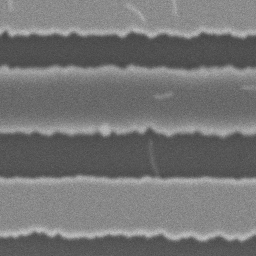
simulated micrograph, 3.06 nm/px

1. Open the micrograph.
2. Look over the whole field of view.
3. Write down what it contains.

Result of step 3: lines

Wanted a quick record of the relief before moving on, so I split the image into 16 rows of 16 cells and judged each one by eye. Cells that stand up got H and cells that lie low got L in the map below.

HHHHHHHHHHHHHHHH
HHHHHHHHHHHHHHHH
LLLLLLLLLLLLLLLL
LLLLLLLLLLLLLLLL
HHHHHHHHHHHHHHHH
HHHHHHHHHHHHHHHH
HHHHHHHHHHHHHHHH
HHHHHHHHHHHHHHHH
LLLLLLLLLLLLLLLL
LLLLLLLLLLLLLLLL
LLLLLLLLLLLLLLLL
HHHHHHHHHHHHHHHH
HHHHHHHHHHHHHHHH
HHHHHHHHHHHHHHHH
HHHHHHHHHHHHHHHH
LLLLLLLLLLLLLLLL